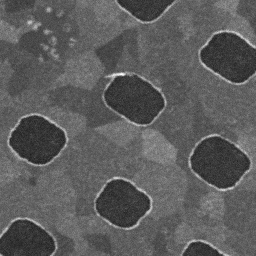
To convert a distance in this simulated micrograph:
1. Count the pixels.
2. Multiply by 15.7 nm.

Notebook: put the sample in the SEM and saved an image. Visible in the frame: holes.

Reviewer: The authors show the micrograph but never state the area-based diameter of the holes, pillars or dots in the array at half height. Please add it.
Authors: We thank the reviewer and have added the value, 0.818 micrometres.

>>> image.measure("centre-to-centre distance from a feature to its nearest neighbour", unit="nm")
1660